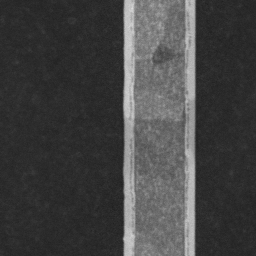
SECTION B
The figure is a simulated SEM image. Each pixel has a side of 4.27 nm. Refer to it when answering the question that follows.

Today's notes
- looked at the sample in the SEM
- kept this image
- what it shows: one or a few lines or trenches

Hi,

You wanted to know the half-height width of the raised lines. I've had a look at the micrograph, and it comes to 268 nm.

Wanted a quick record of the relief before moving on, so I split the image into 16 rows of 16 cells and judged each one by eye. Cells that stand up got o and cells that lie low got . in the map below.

........oooo....
........oooo....
........oooo....
........oooo....
........oooo....
........oooo....
........oooo....
........oooo....
........oooo....
........oooo....
........oooo....
........oooo....
........oooo....
........oooo....
........oooo....
........oooo....